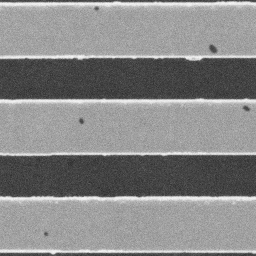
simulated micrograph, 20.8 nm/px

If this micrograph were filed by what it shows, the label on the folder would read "lines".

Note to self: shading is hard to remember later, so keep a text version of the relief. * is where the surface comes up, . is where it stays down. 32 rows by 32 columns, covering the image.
********************************
********************************
********************************
********************************
********************************
********************************
********************************
................................
................................
................................
................................
................................
................................
********************************
********************************
********************************
********************************
********************************
********************************
................................
................................
................................
................................
................................
................................
********************************
********************************
********************************
********************************
********************************
********************************
.......**..*...**..*....********